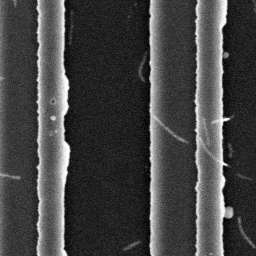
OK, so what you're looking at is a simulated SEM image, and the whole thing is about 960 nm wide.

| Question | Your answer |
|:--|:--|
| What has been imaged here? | lines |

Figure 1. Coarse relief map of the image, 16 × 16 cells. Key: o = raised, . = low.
oooo.....ooooo..
oooo.....ooooo..
oooo.....ooooo..
oooo.....ooooo..
oooo.....ooooo..
oooo.....ooooo..
oooo.....ooooo..
oooo.....ooooo..
oooo.....ooooo..
oooo.....ooooo..
oooo.....ooooo..
oooo.....ooooo..
oooo.....ooooo..
oooo.....ooooo..
oooo.....ooooo..
oooo.....ooooo..